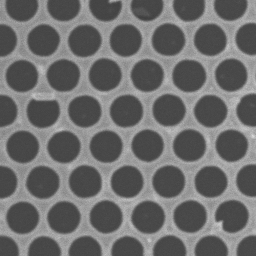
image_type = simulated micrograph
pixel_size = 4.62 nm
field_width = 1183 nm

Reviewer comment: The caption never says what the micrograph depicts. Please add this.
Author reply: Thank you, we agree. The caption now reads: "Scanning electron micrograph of a regular array of holes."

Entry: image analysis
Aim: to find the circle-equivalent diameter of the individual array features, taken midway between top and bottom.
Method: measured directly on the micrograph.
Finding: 149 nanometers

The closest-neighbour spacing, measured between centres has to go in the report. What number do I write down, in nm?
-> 187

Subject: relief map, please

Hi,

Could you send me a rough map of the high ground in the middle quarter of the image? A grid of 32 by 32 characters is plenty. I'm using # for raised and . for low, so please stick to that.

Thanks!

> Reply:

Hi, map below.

...####.......####......####....
....###.......###........##.....
....##........###........##.....
....##........###........##.....
....###.......###.......###.....
...####......#####......####....
..######....#######....######...
#########################.######
###.....#####.....######.....###
##.......###.......####.......##
#........###........##........##
#........##.........##........##
#........##.........##........##
#........###.......####.......##
##......#####......#####.....###
####...#######...########..#####
####################..########..
..######.....#####......#####...
....###.......###.......####....
....###........##........##.....
....##.........##........##.....
....###........##........###....
....###.......####......####....
...#####.....######....######...
.#########..####################
####..#########..#########..####
###.....#####......####......###
##.......###.......####.......##
#........###........##........##
#........###........##........##
#........###........##........##
##.......###.......####.......##